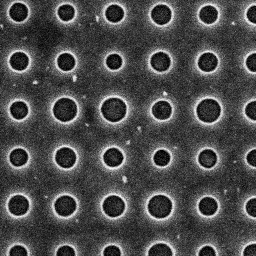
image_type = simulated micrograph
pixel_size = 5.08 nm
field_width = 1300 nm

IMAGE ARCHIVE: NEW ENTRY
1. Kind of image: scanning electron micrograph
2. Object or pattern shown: a regular array of holes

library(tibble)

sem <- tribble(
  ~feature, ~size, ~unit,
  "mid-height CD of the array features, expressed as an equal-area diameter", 103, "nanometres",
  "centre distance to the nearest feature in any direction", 237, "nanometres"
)